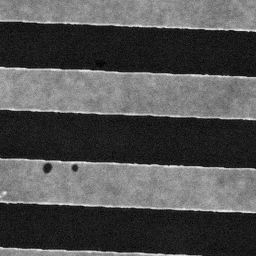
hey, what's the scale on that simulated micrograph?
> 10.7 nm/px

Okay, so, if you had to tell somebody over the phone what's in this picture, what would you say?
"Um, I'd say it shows lines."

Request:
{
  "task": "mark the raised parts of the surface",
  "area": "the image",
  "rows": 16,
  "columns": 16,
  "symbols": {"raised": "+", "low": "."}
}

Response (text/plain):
++++++++++++++++
.....+++++++++++
................
................
+++++++.........
++++++++++++++++
++++++++++++++++
................
................
................
++++++++++++++..
++++++++++++++++
++++++++++++++++
................
................
+...............